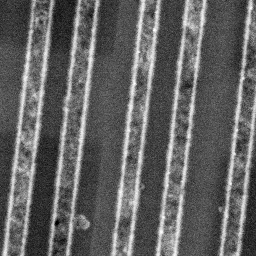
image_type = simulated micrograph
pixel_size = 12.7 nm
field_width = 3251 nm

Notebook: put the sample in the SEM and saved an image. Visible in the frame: parallel lines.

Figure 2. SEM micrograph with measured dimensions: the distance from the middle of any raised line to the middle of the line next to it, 665 nm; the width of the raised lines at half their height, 0.213 microns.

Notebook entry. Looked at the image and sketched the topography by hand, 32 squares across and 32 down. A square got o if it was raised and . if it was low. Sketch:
....oo....oo......oo...ooo.....o
....oo....oo......oo...oo......o
....oo....oo......oo...oo......o
....oo...ooo......o....oo......o
....oo...ooo.....oo....oo......o
....oo...oo......oo....oo......o
....oo...oo......oo....oo......o
...ooo...oo......oo....oo......o
...ooo...oo......oo...ooo.....oo
...oo....oo......oo...oo......oo
...oo....oo......oo...oo......oo
...oo....oo......oo...oo......oo
...oo...ooo.....oo....oo......oo
...oo...ooo.....oo....oo......oo
...oo...oo......oo....oo......oo
...oo...oo......oo....oo......oo
..ooo...oo......oo....oo.....ooo
..ooo...oo......oo...ooo.....oo.
..oo....oo......oo...oo......oo.
..oo....oo......oo...oo......oo.
..oo....oo......o....oo......oo.
..oo...ooo.....oo....oo......oo.
..oo...oo......oo....oo......oo.
..oo...oo......oo....oo......oo.
.ooo...oo......oo....oo......oo.
.ooo...oo......oo....oo.....oo..
.oo....oo......oo...oo......oo..
.oo....oo......oo...oo......oo..
.oo....oo......oo...oo......oo..
.oo....oo.....oo....oo......oo..
.oo...ooo.....oo....oo......oo..
.oo...oo......oo....oo......oo..